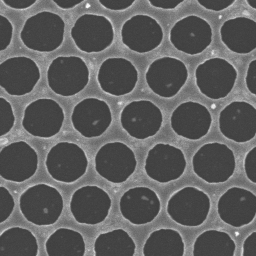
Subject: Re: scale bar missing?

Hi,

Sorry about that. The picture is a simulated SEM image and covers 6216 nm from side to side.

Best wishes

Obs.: a regular array of holes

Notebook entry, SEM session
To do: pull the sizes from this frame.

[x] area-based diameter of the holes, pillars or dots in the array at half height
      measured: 0.976 microns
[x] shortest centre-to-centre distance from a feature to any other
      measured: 1180 nm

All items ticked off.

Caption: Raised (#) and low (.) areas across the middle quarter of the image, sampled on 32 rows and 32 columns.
......###........####.........##
......###.........###..........#
......###..........##..........#
......##..........##...........#
......###.........###.........##
.....####.........###.........##
.....#####.......#####.......###
...#########....#######.....####
######..########################
####......#######.....#########.
###........####........######...
##.........####.........####....
##..........##..........###.....
##..........##...........##.....
##..........##..........###.....
##.........####.........###.....
###........####.........###.....
####.....#######.......#####....
##################...##########.
.############.##################
....######......#######....#####
.....####........####........###
.....###..........###.........##
......##..........###.........##
......##..........##..........##
......##..........##..........##
.....###..........##..........##
.....####........####.........##
....######......######.......###
..##########...#########..######
######..########################
###.......######......#######...